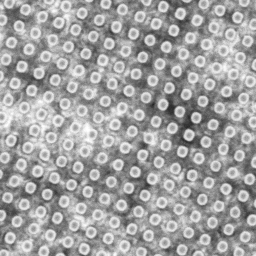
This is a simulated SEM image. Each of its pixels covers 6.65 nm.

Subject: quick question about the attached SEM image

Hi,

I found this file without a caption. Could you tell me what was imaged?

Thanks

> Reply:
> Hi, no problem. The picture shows a regular array of raised bodies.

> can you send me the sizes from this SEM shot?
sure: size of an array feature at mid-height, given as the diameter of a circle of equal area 10.3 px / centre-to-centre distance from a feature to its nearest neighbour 118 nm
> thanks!